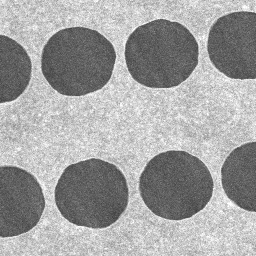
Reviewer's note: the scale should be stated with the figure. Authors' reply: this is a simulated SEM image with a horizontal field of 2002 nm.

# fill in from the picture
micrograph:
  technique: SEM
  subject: holes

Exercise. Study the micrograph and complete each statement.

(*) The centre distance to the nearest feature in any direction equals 657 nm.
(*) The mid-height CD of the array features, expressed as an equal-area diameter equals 562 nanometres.